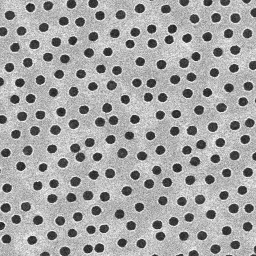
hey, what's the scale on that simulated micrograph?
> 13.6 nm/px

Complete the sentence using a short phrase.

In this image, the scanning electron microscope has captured a regular array of holes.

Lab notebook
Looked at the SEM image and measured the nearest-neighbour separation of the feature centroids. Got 231 nm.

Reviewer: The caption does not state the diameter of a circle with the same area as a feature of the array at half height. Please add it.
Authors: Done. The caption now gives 0.133 micrometres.